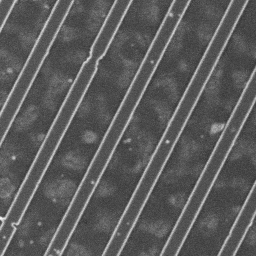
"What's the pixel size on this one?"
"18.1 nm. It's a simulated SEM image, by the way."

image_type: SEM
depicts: parallel lines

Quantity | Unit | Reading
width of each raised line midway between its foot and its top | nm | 256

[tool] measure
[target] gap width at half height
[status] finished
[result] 0.683 micrometres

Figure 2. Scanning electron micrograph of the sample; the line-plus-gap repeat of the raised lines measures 936 nanometres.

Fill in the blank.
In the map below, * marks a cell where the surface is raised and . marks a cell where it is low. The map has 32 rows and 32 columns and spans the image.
**.....**.....**.....***.....**.
*.....***.....**.....**.....**..
*.....**.....**.....**......**..
.....***.....**.....**.....**...
.....**.....**.....**......**...
....**......**.....**.....**....
....**.....**.....**......**....
...**......*......**.....**.....
..***.....**.....**...*..**.....
..**......**.....**.....**.....*
..**.....**.....**......**.....*
.**......**.....**.....**.....**
.**.....**.....**......**.....**
**......**.....**.....**.....**.
**.....**.....**......**.....**.
*......**.....**.....**....***..
*.....**...*.**......**...****..
.....***..**.**.....**.....**...
.....**.....**......**.....**...
.....**.....**.....**.....**....
....**.....**......**.....**....
....**.....**...*.**.....**.....
...**.....**......**.....**.....
*..**.....**.....**.....**......
*.**.....**......**.....**.....*
..**.....**.....**.....**......*
.**.....**......**.....**.....**
***.....**.....**.....**......**
**.....**......**.....**.....**.
*......**.....**.....**......**.
*.....**......**.....**.....**..
......**.....**.....**......**..